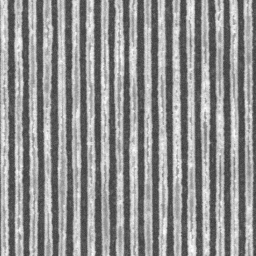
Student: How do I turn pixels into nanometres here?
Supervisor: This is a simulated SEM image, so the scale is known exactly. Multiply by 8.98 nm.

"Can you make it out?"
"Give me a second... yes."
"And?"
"parallel lines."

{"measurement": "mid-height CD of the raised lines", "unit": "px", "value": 6.12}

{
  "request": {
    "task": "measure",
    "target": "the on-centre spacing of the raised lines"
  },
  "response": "129 nanometres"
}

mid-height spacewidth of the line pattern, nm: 71.9